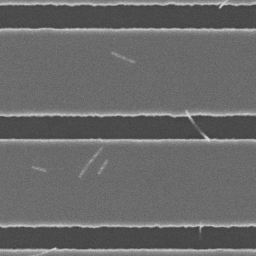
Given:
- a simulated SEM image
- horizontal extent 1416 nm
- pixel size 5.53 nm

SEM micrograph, lines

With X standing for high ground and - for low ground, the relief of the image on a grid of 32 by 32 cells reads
XXXXXXXXXXXXXXXXXXXXXXXXXXXXXXXX
--------------------------------
--------------------------------
--------------------------------
XXXXXXXXXXXXXXXXXXXXXXXXXXXXXXXX
XXXXXXXXXXXXXXXXXXXXXXXXXXXXXXXX
XXXXXXXXXXXXXXXXXXXXXXXXXXXXXXXX
XXXXXXXXXXXXXXXXXXXXXXXXXXXXXXXX
XXXXXXXXXXXXXXXXXXXXXXXXXXXXXXXX
XXXXXXXXXXXXXXXXXXXXXXXXXXXXXXXX
XXXXXXXXXXXXXXXXXXXXXXXXXXXXXXXX
XXXXXXXXXXXXXXXXXXXXXXXXXXXXXXXX
XXXXXXXXXXXXXXXXXXXXXXXXXXXXXXXX
XXXXXXXXXXXXXXXXXXXXXXXXXXXXXXXX
XXXXXX---XX-XX-XX----XXX---X----
--------------------------------
--------------------------------
XXXXXXXXXXXXXXXXXXXXXXXXXXXXXXXX
XXXXXXXXXXXXXXXXXXXXXXXXXXXXXXXX
XXXXXXXXXXXXXXXXXXXXXXXXXXXXXXXX
XXXXXXXXXXXXXXXXXXXXXXXXXXXXXXXX
XXXXXXXXXXXXXXXXXXXXXXXXXXXXXXXX
XXXXXXXXXXXXXXXXXXXXXXXXXXXXXXXX
XXXXXXXXXXXXXXXXXXXXXXXXXXXXXXXX
XXXXXXXXXXXXXXXXXXXXXXXXXXXXXXXX
XXXXXXXXXXXXXXXXXXXXXXXXXXXXXXXX
XXXXXXXXXXXXXXXXXXXXXXXXXXXXXXXX
XXXXXXXXXXXXXXXXXXXXXXXXXXXXXXXX
--------------------------------
--------------------------------
--------------------------------
XXXXXXXXXXXXXXXXXXXXXXXXXXXXXXXX